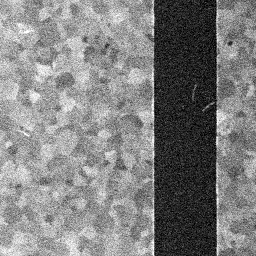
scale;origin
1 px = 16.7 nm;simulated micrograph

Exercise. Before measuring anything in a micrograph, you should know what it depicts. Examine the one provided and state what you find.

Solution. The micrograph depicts one or a few lines or trenches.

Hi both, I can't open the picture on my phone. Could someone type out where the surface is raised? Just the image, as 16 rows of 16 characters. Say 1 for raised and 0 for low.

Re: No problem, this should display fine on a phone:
1111111111000011
1111111111000011
1111111111000011
1111111111000011
1111111111000011
1111111111000011
1111111111000011
1111111111000011
1111111111000011
1111111111000011
1111111111000011
1111111111000011
1111111111000011
1111111111000011
1111111111000011
1111111111000011